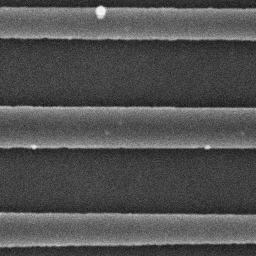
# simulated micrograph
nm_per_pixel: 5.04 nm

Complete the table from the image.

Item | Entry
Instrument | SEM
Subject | lines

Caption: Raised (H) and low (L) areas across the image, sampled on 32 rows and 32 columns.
LLLLLLLLLLLLLLLLLLLLLLLLLLLLLLLL
HHHHHHHHHHHHHHHHHHHHHHHHHHHHHHHH
HHHHHHHHHHHHHHHHHHHHHHHHHHHHHHHH
HHHHHHHHHHHHHHHHHHHHHHHHHHHHHHHH
HHHHHHHHHHHHHHHHHHHHHHHHHHHHHHHH
LLLLLLLLLLLLLLLLLLLLLLLLLLLLLLLL
LLLLLLLLLLLLLLLLLLLLLLLLLLLLLLLL
LLLLLLLLLLLLLLLLLLLLLLLLLLLLLLLL
LLLLLLLLLLLLLLLLLLLLLLLLLLLLLLLL
LLLLLLLLLLLLLLLLLLLLLLLLLLLLLLLL
LLLLLLLLLLLLLLLLLLLLLLLLLLLLLLLL
LLLLLLLLLLLLLLLLLLLLLLLLLLLLLLLL
LLLLLLLLLLLLLLLLLLLLLLLLLLLLLLLL
HHHHHHHHHHHHHHHHHHHHHHLLLLLLLLLL
HHHHHHHHHHHHHHHHHHHHHHHHHHHHHHHH
HHHHHHHHHHHHHHHHHHHHHHHHHHHHHHHH
HHHHHHHHHHHHHHHHHHHHHHHHHHHHHHHH
HHHHHHHHHHHHHHHHHHHHHHHHHHHHHHHH
LLLLHLLLLLLLLLLLLLLLLLLLLLHLLLLL
LLLLLLLLLLLLLLLLLLLLLLLLLLLLLLLL
LLLLLLLLLLLLLLLLLLLLLLLLLLLLLLLL
LLLLLLLLLLLLLLLLLLLLLLLLLLLLLLLL
LLLLLLLLLLLLLLLLLLLLLLLLLLLLLLLL
LLLLLLLLLLLLLLLLLLLLLLLLLLLLLLLL
LLLLLLLLLLLLLLLLLLLLLLLLLLLLLLLL
LLLLLLLLLLLLLLLLLLLLLLLLLLLLLLLL
LLLLLLLLLLLLLLLLLLLLLLLLLLLLLLLL
HHHHHHHHHHHHHHHHHHHHHHHHHHHHHHHH
HHHHHHHHHHHHHHHHHHHHHHHHHHHHHHHH
HHHHHHHHHHHHHHHHHHHHHHHHHHHHHHHH
HHHHHHHHHHHHHHHHHHHHHLLLLLLLLLLL
LLLLLLLLLLLLLLLLLLLLLLLLLLLLLLLL